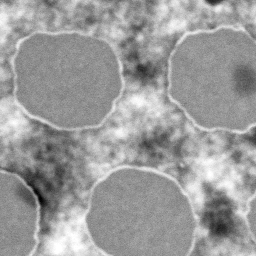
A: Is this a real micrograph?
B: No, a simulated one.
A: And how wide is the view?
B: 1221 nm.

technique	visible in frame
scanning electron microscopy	raised bodies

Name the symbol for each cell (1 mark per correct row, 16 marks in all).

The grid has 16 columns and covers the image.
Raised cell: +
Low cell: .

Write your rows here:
................
................
.++++++....+++++
.++++++....+++++
.+++++++...+++++
.+++++++...+++++
.++++++....+++++
..+++++.....++++
................
................
........+.......
++....+++++.....
++....++++++....
++...+++++++...+
++...+++++++....
++....++++++....